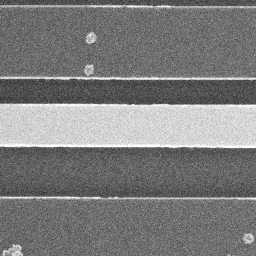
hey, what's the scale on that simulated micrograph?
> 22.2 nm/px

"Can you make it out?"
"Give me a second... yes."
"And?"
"lines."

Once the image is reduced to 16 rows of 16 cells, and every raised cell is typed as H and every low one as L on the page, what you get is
HHHHHHHHHHHHHHHH
HHHHHHHHHHHHHHHH
HHHHHHHHHHHHHHHH
HHHHHHHHHHHHHHHH
HHHHHHHHHHHHHHHH
LLLLLLLLLLLLLLLL
LLLLLLLLLLLLLLLL
HHHHHHHHHHHHHHHH
HHHHHHHHHHHHHHHH
LLLLLLLLLLLLLLLL
LLLLLLLLLLLLLLLL
LLLLLLLLLLLLLLLL
HHHHHHHHHHHHHHHH
HHHHHHHHHHHHHHHH
HHHHHHHHHHHHHHHH
HHHHHHHHHHHHHHHH